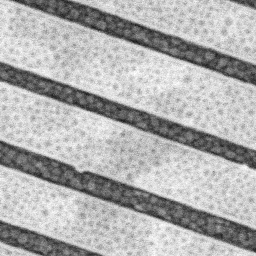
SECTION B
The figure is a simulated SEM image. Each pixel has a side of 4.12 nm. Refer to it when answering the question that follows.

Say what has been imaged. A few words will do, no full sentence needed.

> one or a few lines or trenches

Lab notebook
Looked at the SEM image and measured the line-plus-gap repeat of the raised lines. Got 0.317 µm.